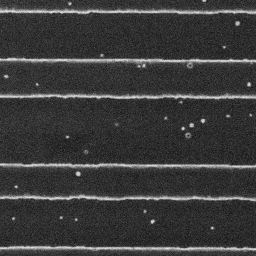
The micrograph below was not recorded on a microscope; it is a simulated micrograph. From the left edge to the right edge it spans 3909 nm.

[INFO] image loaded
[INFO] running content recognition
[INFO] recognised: lines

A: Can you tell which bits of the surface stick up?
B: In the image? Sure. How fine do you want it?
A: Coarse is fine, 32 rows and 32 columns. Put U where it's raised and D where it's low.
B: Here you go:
UUUUUUUUUUUUUUUUUUUUUUUUUUUUUUUU
UUUUUUUUUUUUUUUUUUUUUUUUUUUUUUUU
DDDDDDDDDDDDDDDDDDDDDDDDDDDDDDDD
DDDDDDDDDDDDDDDDDDDDDDDDDDDDDDDD
DDDDDDDDDDDDDDDDDDDDDDDDDDDDDDDD
DDDDDDDDDDDDDDDDDDDDDDDDDDDDDDDD
DDDDDDDDDDDDDDDDDDDDDDDDDDDDDDDD
UUUUUUUUUUUUUUUUUDUUDDDDDDDDDDDD
UUUUUUUUUUUUUUUUUUUUUUUUUUUUUUUU
UUUUUUUUUUUUUUUUUUUUUUUUUUUUUUUU
UUUUUUUUUUUUUUUUUUUUUUUUUUUUUUUU
UUUUUUUUUUUUUUUUUUUUUUUUUUUUUUUU
DDDDDDDDDDDDDDDDDDDDDDDDDDDDDDDD
DDDDDDDDDDDDDDDDDDDDDDDDDDDDDDDD
DDDDDDDDDDDDDDDDDDDDDDDDDDDDDDDD
DDDDDDDDDDDDDDDDDDDDDDDDDDDDDDDD
DDDDDDDDDDDDDDDDDDDDDDDDDDDDDDDD
DDDDDDDDDDDDDDDDDDDDDDDDDDDDDDDD
DDDDDDDDDDDDDDDDDDDDDDDDDDDDDDDD
DDDDDDDDDDDDDDDDDDDDDDDDDDDDDDDD
DDDDDDDDDDDDDDDDDDDDDDDDDDDDDDDD
UUUUUUUUUUUUUUUUUUUUUUUUUUUUUUUU
UUUUUUUUUUUUUUUUUUUUUUUUUUUUUUUU
UUUUUUUUUUUUUUUUUUUUUUUUUUUUUUUU
UUUUUUUUUUUUUUUUUUUUUUUUUUUUUUUU
DDDDDDDDDDDDDDDDDDDDDDDDDDDDDDDD
DDDDDDDDDDDDDDDDDDDDDDDDDDDDDDDD
DDDDDDDDDDDDDDDDDDDDDDDDDDDDDDDD
DDDDDDDDDDDDDDDDDDDDDDDDDDDDDDDD
DDDDDDDDDDDDDDDDDDDDDDDDDDDDDDDD
DDDDDDDDDDDDDDDDDDDDDDDDDDDDDDDD
UUUUUUUUUUUUUUUUUUUUUUUUUUUUUUUU